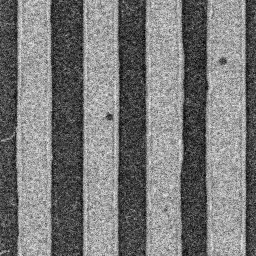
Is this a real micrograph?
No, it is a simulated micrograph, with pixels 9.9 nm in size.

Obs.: one or a few lines or trenches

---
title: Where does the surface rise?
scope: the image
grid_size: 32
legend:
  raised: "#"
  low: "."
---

..####.....####...#####...####..
...###.....####...#####...####..
...###.....####...#####...####..
...###.....####...#####...####..
..####.....####...#####...####..
..####.....####...#####...####..
..####.....####...#####...####..
..####.....####...#####...#####.
..####.....####...#####...#####.
..####.....####...#####...#####.
..####.....####...#####...####..
..####.....####...#####...####..
..####.....####...#####...####..
..####.....####...#####...#####.
..####.....####...#####...#####.
..####.....####...#####...#####.
..####.....####...#####...####..
..####.....####...#####...####..
..####.....####...#####...####..
..####.....####...#####...####..
..####.....####...#####...####..
..####.....####...#####...####..
..####.....####...####....####..
..####.....####....###....#####.
..####.....####....###....#####.
..####.....####....###....#####.
..####.....####....###....#####.
..####.....####....###....#####.
..####.....####....###....#####.
..####.....####....###....####..
..####.....####....###....####..
..####.....####....####...####..